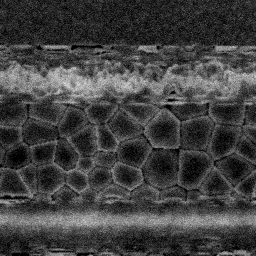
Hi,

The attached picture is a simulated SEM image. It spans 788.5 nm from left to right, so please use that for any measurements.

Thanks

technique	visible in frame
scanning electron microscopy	one or a few lines or trenches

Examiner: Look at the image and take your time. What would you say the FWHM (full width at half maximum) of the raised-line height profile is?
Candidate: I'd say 438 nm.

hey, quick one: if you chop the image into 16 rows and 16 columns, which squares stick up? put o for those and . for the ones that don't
................
................
................
................
................
oooooooooooooooo
oooooooooooooooo
oooooooooooooooo
oooooooooooooooo
oooooooooooooooo
oooooooooooooooo
oooooooooooooooo
oooooooooooooooo
oooooooooooooooo
................
................